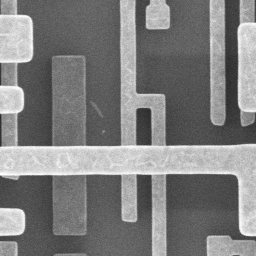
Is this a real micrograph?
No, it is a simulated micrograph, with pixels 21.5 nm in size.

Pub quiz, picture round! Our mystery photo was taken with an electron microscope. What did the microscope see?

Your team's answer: wiring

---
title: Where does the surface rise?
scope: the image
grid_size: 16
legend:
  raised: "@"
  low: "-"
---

----------------
@@-------------@
@@-------------@
@@-------------@
---------------@
@--------------@
@--------------@
----------------
----------------
@@@@@@@@@@@@@@@@
@@@@@@@@@@@@@@@@
---------------@
---------------@
@--------------@
@--------------@
----------------